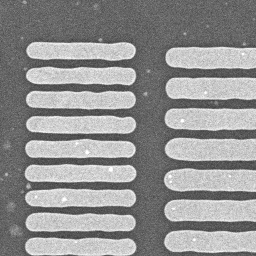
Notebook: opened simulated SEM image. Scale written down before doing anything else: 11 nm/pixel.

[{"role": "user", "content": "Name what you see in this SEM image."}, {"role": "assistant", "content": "groups of lines, slits or small figures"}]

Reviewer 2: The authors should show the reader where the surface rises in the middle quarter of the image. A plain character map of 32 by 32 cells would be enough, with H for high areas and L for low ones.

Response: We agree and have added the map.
LLLLLLLLLLLLLLLLLLLLLLLLLLLHHHHH
HHHHHHHHHHHHHHHHHLLLLLLLLLLLLLLL
HHHHHHHHHHHHHHHHHHLLLLLLLLLLLLLL
HHHHHHHHHHHHHHHHHHLLLLLLLLLLLLLL
HHHHHHHHHHHHHHHHHLLLLLLLLLHHHHHH
LLLLLLLLLLLLLLLLLLLLLLLLLLHHHHHH
LLLLLLLLLLLLLLLLLLLLLLLLLLHHHHHH
HHHHHHHHHHHHHHHHHLLLHLLLLLHHHHHH
HHHHHHHHHHHHHHHHHHLLLLLLLLLHHHHH
HHHHHHHHHHHHHHHHHHLLLLLLLLLLLLLL
HHHHHHHHHHHHHHHHHLLLLLLLLLLLLLLL
LLLLLLLLLLLLLLLLLLLLLLLLLLHHHHHH
LLLLLLLLLLLLLLLLLLLLLLLLLLHHHHHH
HHHHHHHHHHHHHLLHHLLLLLLLLHHHHHHH
HHHHHHHHHHHHHHHHHHLLLLLLLHHHHHHH
HHHHHHHHHHHHHHHHHHLLLLLLLLHHHHHH
HHHHHHHHHHHHHHHHHLLLLLLLLLLLLLLL
LLLLLLLLLLLLLLLLLLLLLLLLLLLLLLLL
LLLLLLLLLLLLLLLLLLLLLLLLLLLLLLLL
HHHHHHHHHHHHHHHHLLLLLLLLLLHHHHHH
HHHHHHHHHHHHHHHHHHLLLLLLLHHHHHHH
HHHHHHHHHHHHHHHHHHLLLLLLLHHHHHHH
HHHHHHHHHHHHHHHHHLLLLLLLLLHHHHHH
LLLLLLLLLLLLLLLLLLLLLLLLLLLHHHHH
LLLLLLLLLLLLLLLLLLLLLLLLLLLLLLLL
HHHHHHHHHHLLLLLHHLLLLLLLLLLLLLLL
HHHHHHHHHHHHHHHHHHLLLLLLLLLLLHHH
HHHHHHHHHHHHHHHHHHLLLLLLLLHHHHHH
HHHHHHHHHHHHHHHHHHLLLLLLLHHHHHHH
LLLLLLLLLLLLLLLLLLLLLLLLLHHHHHHH
LLLLLLLLLLLLLLLLLLLLLLLLLLHHHHHH
HHHLHHLLLLLLLLLLLLLLLLLLLLLHHHHH